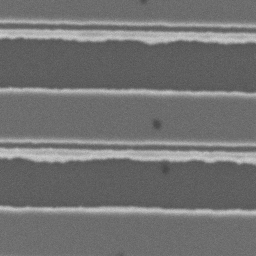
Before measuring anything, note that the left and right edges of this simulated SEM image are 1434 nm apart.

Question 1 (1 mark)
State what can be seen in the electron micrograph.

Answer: lines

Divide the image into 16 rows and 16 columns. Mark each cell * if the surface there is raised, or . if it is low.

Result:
****************
****************
.........**.****
................
................
................
****************
****************
****************
****************
................
................
................
****************
****************
****************